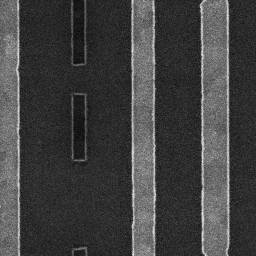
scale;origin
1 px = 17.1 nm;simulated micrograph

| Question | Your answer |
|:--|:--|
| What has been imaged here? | one or a few lines or trenches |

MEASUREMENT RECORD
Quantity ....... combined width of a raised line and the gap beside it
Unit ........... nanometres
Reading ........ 1190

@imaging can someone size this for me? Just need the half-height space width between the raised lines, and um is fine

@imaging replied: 0.824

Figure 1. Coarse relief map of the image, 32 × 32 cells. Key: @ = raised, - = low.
@@-------@@------@@------@@@----
@@-------@@------@@------@@@----
@@-------@@------@@------@@@----
@@-------@@------@@------@@@----
@@-------@@------@@------@@@----
@@-------@@------@@------@@@----
@@-------@@------@@------@@@----
@@-------@@------@@------@@@----
@@---------------@@------@@@----
@@---------------@@------@@@----
@@---------------@@------@@@----
@@---------------@@------@@@----
@@-------@@------@@------@@@----
@@-------@@------@@------@@@----
@@-------@@------@@------@@@----
@@-------@@------@@------@@@----
@@-------@@------@@------@@@----
@@-------@@------@@------@@@----
@@-------@@------@@------@@@----
@@-------@@------@@------@@@----
@@---------------@@------@@@----
@@---------------@@------@@@@---
@@---------------@@------@@@@---
@@---------------@@------@@@@---
@@---------------@@------@@@@---
@@---------------@@------@@@@---
@@---------------@@------@@@@---
@@---------------@@------@@@@---
@@---------------@@------@@@@---
@@---------------@@------@@@@---
@@---------------@@------@@@@---
@@-------@@------@@-------@@----